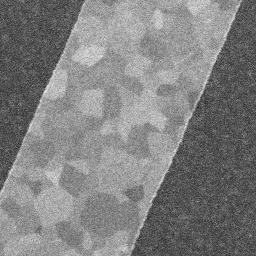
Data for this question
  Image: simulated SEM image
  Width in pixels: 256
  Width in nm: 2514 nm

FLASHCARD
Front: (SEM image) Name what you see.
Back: one or a few lines or trenches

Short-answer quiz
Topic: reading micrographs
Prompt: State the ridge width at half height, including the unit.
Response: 1.4 microns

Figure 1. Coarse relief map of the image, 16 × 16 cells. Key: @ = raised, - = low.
-----@@@@@@@@@@-
-----@@@@@@@@@--
----@@@@@@@@@@--
----@@@@@@@@@@--
---@@@@@@@@@@---
---@@@@@@@@@@---
--@@@@@@@@@@----
--@@@@@@@@@@----
--@@@@@@@@@-----
-@@@@@@@@@@-----
-@@@@@@@@@@-----
@@@@@@@@@@------
@@@@@@@@@@------
@@@@@@@@@-------
@@@@@@@@@-------
@@@@@@@@--------